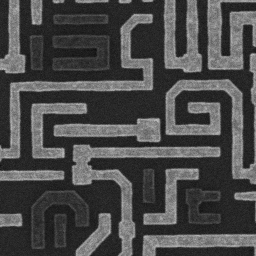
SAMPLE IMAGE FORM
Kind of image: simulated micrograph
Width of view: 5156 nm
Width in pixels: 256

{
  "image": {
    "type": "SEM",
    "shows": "wiring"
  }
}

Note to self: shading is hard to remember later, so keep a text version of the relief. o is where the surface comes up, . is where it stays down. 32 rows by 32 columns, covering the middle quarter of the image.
ooooooooooo....ooooooo...ooooooo
....ooo.............oo........oo
....................oo..........
....................oo..........
.........ooooooooooooo......oooo
oooooooooooooooooooooo.....ooooo
.......oooooo.............oooo..
..........................ooo...
..........................oo....
..........................oo....
ooooo.....................oo...o
oooooo....................oo...o
..........................oo....
..........................oo....
..................oooooo..oo....
oooooooooooooooooooooooo..oo.ooo
oooooooooooooooooooooooo.ooooooo
oooooooooooooooooooooooo..oooooo
..................oooooo........
................................
...ooo..........................
..oooooooooooooooooooooooooooooo
..oooooooooooooooooooooooooooooo
..ooooo.........................
...ooo..........................
..oooo..........................
..ooooo...................oooooo
..ooooooooooooo.....oo...ooooooo
..ooooooooooooo.....oo....oooooo
..ooooo......oooo...oo....oo....
..............ooo...oo...ooo....
...............oo...ooo..ooo...o